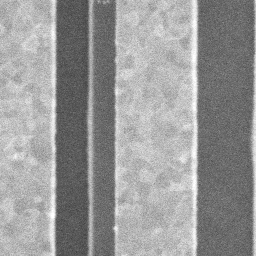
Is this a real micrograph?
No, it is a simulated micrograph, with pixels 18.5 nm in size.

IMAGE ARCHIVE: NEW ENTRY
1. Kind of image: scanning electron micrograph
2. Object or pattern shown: lines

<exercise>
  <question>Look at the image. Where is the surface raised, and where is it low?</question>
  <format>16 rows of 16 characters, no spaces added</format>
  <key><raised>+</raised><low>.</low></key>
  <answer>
+++....+++++....
+++....+++++....
+++....+++++....
+++....+++++....
+++....+++++....
+++....+++++....
+++....+++++....
+++....+++++....
+++....+++++....
+++....+++++....
+++....+++++....
+++....+++++....
+++....+++++....
+++....+++++....
+++....+++++....
+++....+++++....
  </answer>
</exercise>